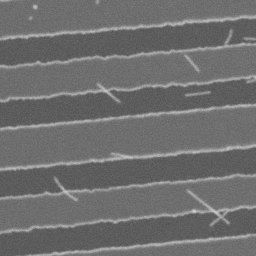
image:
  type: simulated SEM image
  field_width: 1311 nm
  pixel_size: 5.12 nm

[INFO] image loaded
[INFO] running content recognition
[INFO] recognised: lines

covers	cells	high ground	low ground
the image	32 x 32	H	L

HHHHHHHHHHHHHHHHHHHHHHHHHHHHHHHH
HHHHHHHHHHHHHHHHHHHHHHHHHHHHHHHH
HHHHHHHHHHHHHHHHHHHHHHHHHHHHLLLL
HHHHHHHHHHHHHHHHHHLLLLLLLLLLLLLL
HHHHHLLLLLLLLLLLLLLLLLLLLLLLLLLL
LLLLLLLLLLLLLLLLLLLLLLLLLLLLLLHH
LLLLLLLLLLLLLLLLLLLLHHHHHHHHHHHH
LLLLLLLLLHHHHHHHHHHHHHHHHHHHHHHH
HHHHHHHHHHHHHHHHHHHHHHHHHHHHHHHH
HHHHHHHHHHHHHHHHHHHHHHHHHHHHHHHH
HHHHHHHHHHHHHHHHHHHHHHHHHHLLLLLL
HHHHHHHHHHHHHLLLLLLLLLLLLLLLLLLL
HLLLLLLLLLLLLLLLLLLLLLLLLLLLLLLL
LLLLLLLLLLLLLLLLLLLLLLLLLLHHHHHH
LLLLLLLLLLLLLLLLLHHHHHHHHHHHHHHH
LLLLLLHHHHHHHHHHHHHHHHHHHHHHHHHH
HHHHHHHHHHHHHHHHHHHHHHHHHHHHHHHH
HHHHHHHHHHHHHHHHHHHHHHHHHHHHHHHH
HHHHHHHHHHHHHHHHHHHHHHHHHHHHHHHL
HHHHHHHHHHHHHHHHHHHHHLLLLLLLLLLL
HHHHHHHHHLLLLLLLLLLLLLLLLLLLLLLL
LLLLLLLLLLLLLLLLLLLLLLLLLLLLLLLL
LLLLLLLLLLLLLLLLLLLLLLLLHHHHHHHH
LLLLLLLLLLLLLLHHHHHHHHHHHHHHHHHH
LLLHHHHHHHHHHHHHHHHHHHHHHHHHHHHH
HHHHHHHHHHHHHHHHHHHHHHHHHHHHHHHH
HHHHHHHHHHHHHHHHHHHHHHHHHHHHLLLL
HHHHHHHHHHHHHHHHLLLLLLLLLLLLLLLL
HHHHLLLLLLLLLLLLLLLLLLLLLLLLLLLL
LLLLLLLLLLLLLLLLLLLLLLLLLLLLLLHH
LLLLLLLLLLLLLLLLLLLLHHHHHHHHHHHH
LLLLLLLLHHHHHHHHHHHHHHHHHHHHHHHH